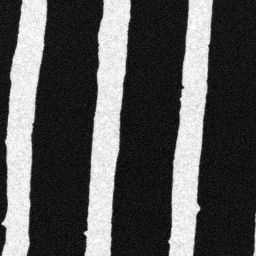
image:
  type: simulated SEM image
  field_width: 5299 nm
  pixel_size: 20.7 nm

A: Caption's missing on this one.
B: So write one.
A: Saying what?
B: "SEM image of one or a few lines or trenches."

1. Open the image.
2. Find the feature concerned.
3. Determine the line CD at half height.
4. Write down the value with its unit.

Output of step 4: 493 nanometers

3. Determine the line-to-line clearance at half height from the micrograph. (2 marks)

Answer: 1240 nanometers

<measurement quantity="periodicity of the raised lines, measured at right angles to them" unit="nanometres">1730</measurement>